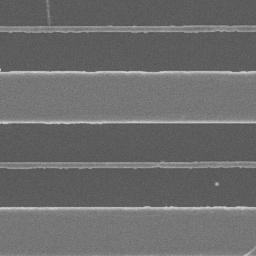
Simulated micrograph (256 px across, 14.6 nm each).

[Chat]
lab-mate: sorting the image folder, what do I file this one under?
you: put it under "lines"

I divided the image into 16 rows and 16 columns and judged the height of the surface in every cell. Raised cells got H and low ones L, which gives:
LLLLLLLLLLLLLLLL
LLLLLLLLLLLLLLLL
LLLLLLLLLLLLLLLL
LLLLLLLLLLLLLLLL
HHHHHHHHHLHHHHHH
HHHHHHHHHHHHHHHH
HHHHHHHHHHHHHHHH
HHHHHHHHHHHHHHHH
LLLLLLLLLLLLLLLL
LLLLLLLLLLLLLLLL
LLLLLLLLLLLLLLLL
LLLLLLLLLLLLLLLL
LLLLLLLLLLLLLLLL
HHHHHHHHHHHHHHHH
HHHHHHHHHHHHHHHH
HHHHHHHHHHHHHHHH